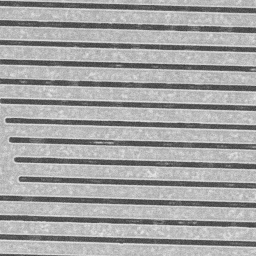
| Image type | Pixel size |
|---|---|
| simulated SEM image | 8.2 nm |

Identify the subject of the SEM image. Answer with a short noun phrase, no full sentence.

parallel lines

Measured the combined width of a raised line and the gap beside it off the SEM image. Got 160 nanometers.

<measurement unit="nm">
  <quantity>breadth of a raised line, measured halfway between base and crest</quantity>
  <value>108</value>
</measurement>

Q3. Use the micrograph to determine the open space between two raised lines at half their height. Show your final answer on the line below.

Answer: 6.12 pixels